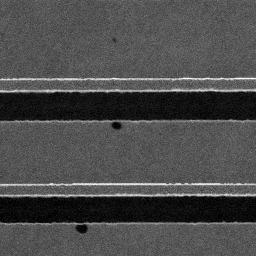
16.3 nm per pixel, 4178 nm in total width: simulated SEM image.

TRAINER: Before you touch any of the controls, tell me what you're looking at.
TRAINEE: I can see lines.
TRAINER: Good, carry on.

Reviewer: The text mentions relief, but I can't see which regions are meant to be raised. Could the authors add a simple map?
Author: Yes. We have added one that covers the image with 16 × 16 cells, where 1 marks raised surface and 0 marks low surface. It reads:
1111111111111111
1111111111111111
1111111111111111
1111111111111111
1111111111111111
1111111111111111
0000000000000000
0000000000000000
1111111111111111
1111111111111111
1111111111111111
1111111111111111
0000000000000000
0000000000000000
1111111111111111
1111111111111111